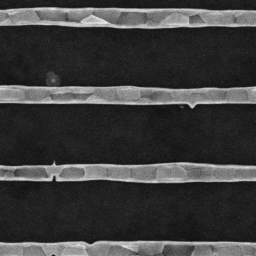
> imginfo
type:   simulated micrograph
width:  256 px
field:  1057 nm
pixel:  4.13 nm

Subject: one or a few lines or trenches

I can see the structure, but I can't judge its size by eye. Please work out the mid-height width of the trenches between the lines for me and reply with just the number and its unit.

254 nanometres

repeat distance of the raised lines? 320 nanometres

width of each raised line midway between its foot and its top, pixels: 16.6